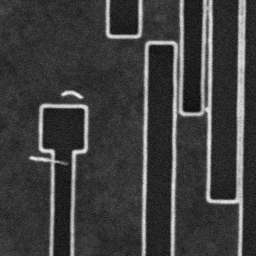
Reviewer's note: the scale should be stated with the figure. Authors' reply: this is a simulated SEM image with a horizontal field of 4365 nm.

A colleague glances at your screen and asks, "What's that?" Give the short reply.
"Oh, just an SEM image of groups of lines, slits or small figures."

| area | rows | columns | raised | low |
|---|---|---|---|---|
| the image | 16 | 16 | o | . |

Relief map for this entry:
ooooooo..oo.....
ooooooo..oo.....
ooooooooooo.....
ooooooooo.......
ooooooooo.......
ooooooooo.......
ooooooooo.......
ooo..oooo..oo...
ooo..oooo..oo...
ooo..oooo..oo...
ooo..oooo..oo...
ooo..oooo..oo...
ooo..oooo..oo...
ooo..oooo..oooo.
ooo..oooo..oooo.
ooo..oooo..oooo.